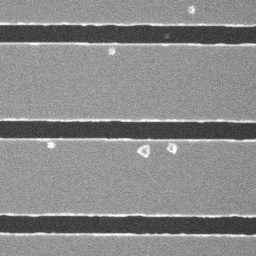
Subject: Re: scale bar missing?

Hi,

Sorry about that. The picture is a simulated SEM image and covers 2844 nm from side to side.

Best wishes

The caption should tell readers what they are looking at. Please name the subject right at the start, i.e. lines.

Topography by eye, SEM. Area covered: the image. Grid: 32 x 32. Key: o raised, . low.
oooooooooooooooooooooooooooooooo
oooooooooooooooooooooooooooooooo
oooooooooooooooooooooooooooooooo
................................
................................
ooooooooooo.o.o.................
oooooooooooooooooooooooooooooooo
oooooooooooooooooooooooooooooooo
oooooooooooooooooooooooooooooooo
oooooooooooooooooooooooooooooooo
oooooooooooooooooooooooooooooooo
oooooooooooooooooooooooooooooooo
oooooooooooooooooooooooooooooooo
oooooooooooooooooooooooooooooooo
oooooooooooooooooooooooooooooooo
................................
................................
ooooooooooooooooo.o.............
oooooooooooooooooooooooooooooooo
oooooooooooooooooooooooooooooooo
oooooooooooooooooooooooooooooooo
oooooooooooooooooooooooooooooooo
oooooooooooooooooooooooooooooooo
oooooooooooooooooooooooooooooooo
oooooooooooooooooooooooooooooooo
oooooooooooooooooooooooooooooooo
oooooooooooooooooooooooooooooooo
................................
................................
oooooooooooooooooooooooooooooooo
oooooooooooooooooooooooooooooooo
oooooooooooooooooooooooooooooooo